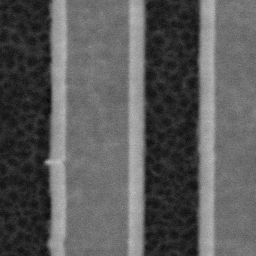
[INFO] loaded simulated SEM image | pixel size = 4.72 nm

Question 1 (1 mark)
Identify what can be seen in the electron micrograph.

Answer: one or a few lines or trenches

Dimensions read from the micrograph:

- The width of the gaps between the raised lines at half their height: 334 nanometers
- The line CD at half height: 0.364 microns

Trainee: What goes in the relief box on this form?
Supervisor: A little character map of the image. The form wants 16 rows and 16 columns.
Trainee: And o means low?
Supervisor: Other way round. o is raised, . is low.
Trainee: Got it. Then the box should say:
....ooooo....ooo
....ooooo....ooo
....ooooo....ooo
....ooooo....ooo
....ooooo....ooo
....ooooo....ooo
....ooooo....ooo
....ooooo....ooo
....ooooo....ooo
....ooooo....ooo
....oooo.....ooo
....oooo.....ooo
....oooo.....ooo
....oooo.....ooo
....oooo.....ooo
....oooo.....ooo